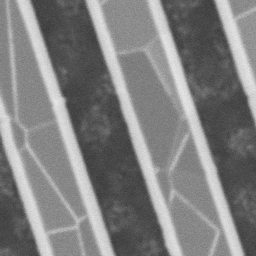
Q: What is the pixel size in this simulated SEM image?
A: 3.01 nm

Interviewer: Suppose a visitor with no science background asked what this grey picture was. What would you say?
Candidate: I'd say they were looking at one or a few lines or trenches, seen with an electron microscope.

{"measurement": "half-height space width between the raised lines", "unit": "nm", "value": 192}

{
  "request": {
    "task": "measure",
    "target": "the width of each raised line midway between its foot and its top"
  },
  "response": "179 nm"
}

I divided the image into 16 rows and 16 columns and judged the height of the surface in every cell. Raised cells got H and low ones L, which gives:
HHLLLLHHHHLLLLHH
HHLLLLHHHHLLLLHH
HHLLLLLHHHLLLLLH
HHHLLLLHHHHLLLLH
HHHLLLLHHHHLLLLH
HHHLLLLLHHHLLLLL
HHHHLLLLHHHHLLLL
HHHHLLLLHHHHLLLL
HHHHLLLLLHHHLLLL
LHHHHLLLLHHHHLLL
LHHHHLLLLHHHHLLL
LHHHHLLLLHHHHLLL
LLHHHHLLLLHHHHLL
LLHHHHLLLLHHHHLL
LLHHHHLLLLLHHHLL
LLLHHHHLLLLHHHHL